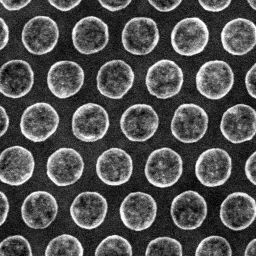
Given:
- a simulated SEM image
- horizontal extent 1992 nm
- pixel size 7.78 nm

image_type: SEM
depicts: a regular array of raised bodies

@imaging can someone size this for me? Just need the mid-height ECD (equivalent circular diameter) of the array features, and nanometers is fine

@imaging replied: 282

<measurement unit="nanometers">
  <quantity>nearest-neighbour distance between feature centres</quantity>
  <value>385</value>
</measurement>